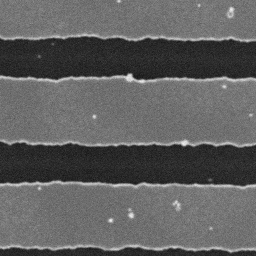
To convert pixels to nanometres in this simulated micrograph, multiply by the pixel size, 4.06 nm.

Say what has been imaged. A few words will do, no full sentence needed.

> lines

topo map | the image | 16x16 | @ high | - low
@@@@@@@@@@@@@@@@
@@@@@@@@@@@@@@@@
--------@--@@@-@
----------------
----------------
@@@@@@@@@@@@@@@@
@@@@@@@@@@@@@@@@
@@@@@@@@@@@@@@@@
@@@@@@@@@@@@@@@@
----------------
----------------
@@@@@@@---------
@@@@@@@@@@@@@@@@
@@@@@@@@@@@@@@@@
@@@@@@@@@@@@@@@@
--@@--@@-@@@@@@@